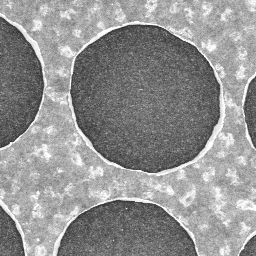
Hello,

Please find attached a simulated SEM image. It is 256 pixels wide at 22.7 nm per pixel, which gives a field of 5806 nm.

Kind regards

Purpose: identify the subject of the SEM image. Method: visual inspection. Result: holes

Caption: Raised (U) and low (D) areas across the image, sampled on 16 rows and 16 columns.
UUUUUUUUUUUUUUUU
DUUUUUUUUUUUUUUU
DDUUUUDDDDDUUUUU
DDUUUDDDDDDDDUUU
DDDUUDDDDDDDDUUU
DDDUDDDDDDDDDDUD
DDDUDDDDDDDDDDUD
DDUUUDDDDDDDDDUD
DUUUUDDDDDDDDUUU
UUUUUUDDDDDDDUUU
UUUUUUUUDDDUUUUU
UUUUUUUUUUUUUUUU
UUUUUUUUUUUUUUUU
DUUUUDDDDDDUUUUU
DUUUDDDDDDDDUUUU
DUUUDDDDDDDDUUUD